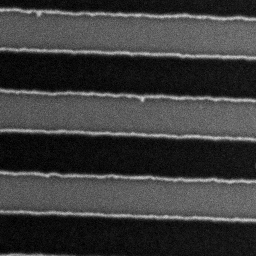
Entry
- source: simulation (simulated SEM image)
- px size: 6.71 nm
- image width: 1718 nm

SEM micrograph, lines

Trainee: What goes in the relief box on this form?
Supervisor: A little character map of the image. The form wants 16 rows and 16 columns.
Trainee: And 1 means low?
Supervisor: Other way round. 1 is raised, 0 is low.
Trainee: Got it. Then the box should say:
1111111111111111
0000000000000000
0000000000000000
1111111111111000
1111111111111111
1111111111111111
0000000000000000
0000000000000000
1111111111100000
1111111111111111
1111111111111111
0000000000000000
0000000000000000
1111111110000000
1111111111111111
1111111111111111